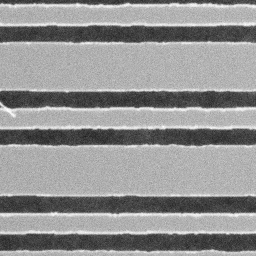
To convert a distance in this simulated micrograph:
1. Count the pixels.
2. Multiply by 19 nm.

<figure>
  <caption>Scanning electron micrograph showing lines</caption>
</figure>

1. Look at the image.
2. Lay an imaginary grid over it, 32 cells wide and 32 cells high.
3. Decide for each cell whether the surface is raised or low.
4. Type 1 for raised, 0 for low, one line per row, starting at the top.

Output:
00000000000000001000000000000000
11111111111111111111111111111111
11111111111111111111111111111111
00000000000000000000000000000000
00000000000000000000000000000000
11111111111111111111111111111111
11111111111111111111111111111111
11111111111111111111111111111111
11111111111111111111111111111111
11111111111111111111111111111111
11111111111111111111111111111111
00000000000000000000000000000000
00000000000000000000000000000000
10000111100000101110000110000011
11111111111111111111111111111111
11111111111111111111111111111111
00000000000000000000000000000000
00000000000000000000000000000000
11111111111111111111111111111111
11111111111111111111111111111111
11111111111111111111111111111111
11111111111111111111111111111111
11111111111111111111111111111111
11111111111111111111111111111111
00000000000000000000000000000000
00000000000000000000000000000000
00000000000000000000000000000000
11111111111111111111111111111111
11111111111111111111111111111111
00000000000000000000000000000000
00000000000000000000000000000000
11111111111111111111111111111011